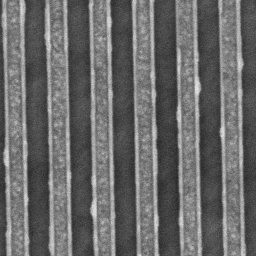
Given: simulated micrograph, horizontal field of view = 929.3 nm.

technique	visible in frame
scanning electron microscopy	parallel lines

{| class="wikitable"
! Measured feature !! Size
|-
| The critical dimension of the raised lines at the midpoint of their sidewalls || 0.0739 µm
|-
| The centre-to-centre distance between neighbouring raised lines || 157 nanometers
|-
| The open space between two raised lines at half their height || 83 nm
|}